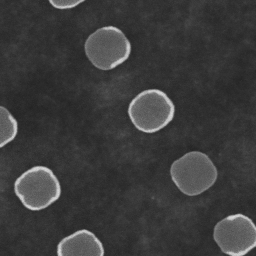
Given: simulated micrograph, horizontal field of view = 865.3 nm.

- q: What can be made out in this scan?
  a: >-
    raised bodies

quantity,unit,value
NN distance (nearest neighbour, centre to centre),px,76.2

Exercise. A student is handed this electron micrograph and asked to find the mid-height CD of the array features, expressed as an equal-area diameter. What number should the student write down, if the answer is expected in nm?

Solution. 147